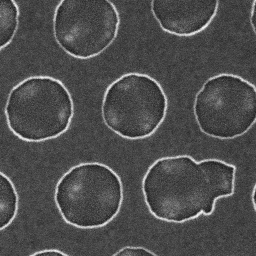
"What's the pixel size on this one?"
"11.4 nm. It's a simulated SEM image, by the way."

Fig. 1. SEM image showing holes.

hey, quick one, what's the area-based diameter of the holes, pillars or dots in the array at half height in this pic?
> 722 nm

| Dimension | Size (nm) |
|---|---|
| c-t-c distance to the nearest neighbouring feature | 1090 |